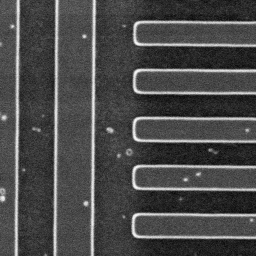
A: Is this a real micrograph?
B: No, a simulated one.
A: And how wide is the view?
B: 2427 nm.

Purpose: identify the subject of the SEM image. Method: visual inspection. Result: groups of lines, slits or small figures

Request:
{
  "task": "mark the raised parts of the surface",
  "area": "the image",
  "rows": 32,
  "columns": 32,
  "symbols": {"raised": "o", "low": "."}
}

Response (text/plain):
oo.....ooooo....................
oo.....ooooo....................
oo.....ooooo....................
oo.....ooooo.....ooooooooooooooo
oo.....ooooo.....ooooooooooooooo
oo.....ooooo.....ooooooooooooooo
oo.....ooooo....................
oo.....ooooo....................
oo.....ooooo....................
oo.....ooooo.....ooooooooooooooo
oo.....ooooo.....ooooooooooooooo
oo.....ooooo.....ooooooooooooooo
oo.....ooooo....................
oo.....ooooo....................
oo.....ooooo....................
oo.....ooooo.....ooooooooooooooo
oo.....ooooo.....ooooooooooooooo
oo.....ooooo.....ooooooooooooooo
oo.....ooooo....................
oo.....ooooo....................
oo.....ooooo....................
oo.....ooooo.....ooooooooooooooo
oo.....ooooo.....ooooooooooooooo
oo.....ooooo.....ooooooooooooooo
oo.....ooooo....................
oo.....ooooo....................
oo.....ooooo....................
oo.....ooooo.....ooooooooooooooo
oo.....ooooo.....ooooooooooooooo
oo.....ooooo.....ooooooooooooooo
oo.....ooooo....................
oo.....ooooo....................